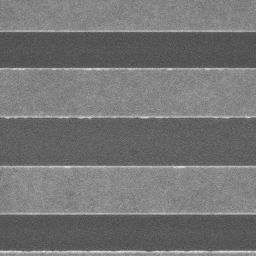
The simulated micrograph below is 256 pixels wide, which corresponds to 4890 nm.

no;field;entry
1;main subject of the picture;lines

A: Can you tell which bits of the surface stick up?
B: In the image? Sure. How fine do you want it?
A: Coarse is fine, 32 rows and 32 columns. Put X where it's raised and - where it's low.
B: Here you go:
XXXXXXXXXXXXXXXXXXXXXXXXXXXXXXXX
XXXXXXXXXXXXXXXXXXXXXXXXXXXXXXXX
XXXXXXXXXXXXXXXXXXXXXXXXXXXXXXXX
XXXXXXXXXXXXXXXXXXXXXXXXXXXXXXXX
--------------------------------
--------------------------------
--------------------------------
--------------------------------
--------------------------------
XXXXXXXXXXXXXXXXXXXXXXXXXXXXXXXX
XXXXXXXXXXXXXXXXXXXXXXXXXXXXXXXX
XXXXXXXXXXXXXXXXXXXXXXXXXXXXXXXX
XXXXXXXXXXXXXXXXXXXXXXXXXXXXXXXX
XXXXXXXXXXXXXXXXXXXXXXXXXXXXXXXX
XXXXXXXXXXXXXXXXXXXXXXXXXXXXXXXX
--------------------------------
--------------------------------
--------------------------------
--------------------------------
--------------------------------
--------------------------------
XXXXXXXXXXXXXXXXXXXXXXXXXXXXXXXX
XXXXXXXXXXXXXXXXXXXXXXXXXXXXXXXX
XXXXXXXXXXXXXXXXXXXXXXXXXXXXXXXX
XXXXXXXXXXXXXXXXXXXXXXXXXXXXXXXX
XXXXXXXXXXXXXXXXXXXXXXXXXXXXXXXX
XXXXXXXXXXXXXXXXXXXXXXXXXXXXXXXX
--------------------------------
--------------------------------
--------------------------------
--------------------------------
XXXXXXXXXXXXXXXXXXXXXXXXXXXXXXXX